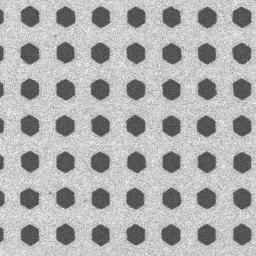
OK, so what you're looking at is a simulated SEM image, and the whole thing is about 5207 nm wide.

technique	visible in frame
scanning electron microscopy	a regular array of holes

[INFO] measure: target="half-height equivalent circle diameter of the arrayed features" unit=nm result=412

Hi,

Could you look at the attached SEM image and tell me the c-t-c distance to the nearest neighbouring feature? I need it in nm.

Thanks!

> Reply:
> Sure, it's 715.